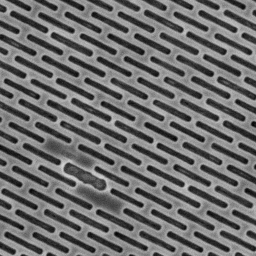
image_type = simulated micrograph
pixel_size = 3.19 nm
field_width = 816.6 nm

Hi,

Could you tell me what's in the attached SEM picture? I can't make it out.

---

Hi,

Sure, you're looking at a regular array of holes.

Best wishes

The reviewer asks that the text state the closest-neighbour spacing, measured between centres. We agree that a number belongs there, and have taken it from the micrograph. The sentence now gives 0.0787 um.